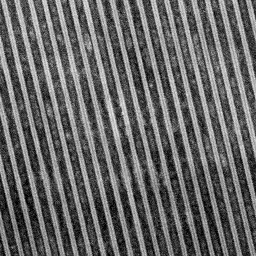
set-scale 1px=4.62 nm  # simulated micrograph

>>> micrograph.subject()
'parallel lines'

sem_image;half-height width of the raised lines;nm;16.9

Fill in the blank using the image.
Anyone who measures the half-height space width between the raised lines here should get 10.1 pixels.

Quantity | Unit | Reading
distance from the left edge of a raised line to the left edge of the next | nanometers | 61.3